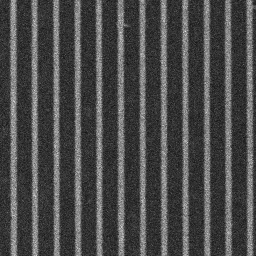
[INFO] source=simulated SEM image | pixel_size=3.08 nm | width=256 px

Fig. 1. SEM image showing parallel lines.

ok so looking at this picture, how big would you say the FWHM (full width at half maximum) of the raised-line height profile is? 0.0177 micrometres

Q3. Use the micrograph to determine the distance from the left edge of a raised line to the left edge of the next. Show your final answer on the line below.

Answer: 66.2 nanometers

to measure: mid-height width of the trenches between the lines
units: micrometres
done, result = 0.0501